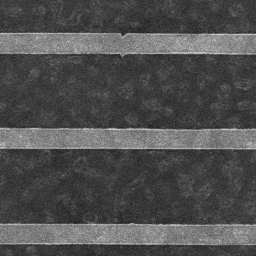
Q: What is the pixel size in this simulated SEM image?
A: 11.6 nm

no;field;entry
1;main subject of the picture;one or a few lines or trenches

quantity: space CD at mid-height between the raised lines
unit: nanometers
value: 886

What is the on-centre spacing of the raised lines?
1110 nm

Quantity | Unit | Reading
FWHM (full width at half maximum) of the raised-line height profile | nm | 223